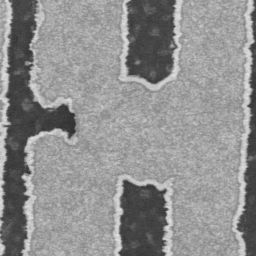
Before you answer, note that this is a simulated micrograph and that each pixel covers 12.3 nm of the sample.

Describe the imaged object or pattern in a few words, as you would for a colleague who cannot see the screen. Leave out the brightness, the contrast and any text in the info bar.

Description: one or a few lines or trenches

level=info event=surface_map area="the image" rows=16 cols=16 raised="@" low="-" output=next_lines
@--@@@@@---@@@@@
@-@@@@@@---@@@@@
--@@@@@@---@@@@@
--@@@@@@---@@@@@
--@@@@@@---@@@@-
--@@@@@@@@@@@@@-
----@@@@@@@@@@@-
-----@@@@@@@@@@-
--@@-@@@@@@@@@@-
--@@@@@@@@@@@@@-
--@@@@@@@@@@@@@-
--@@@@@@--@@@@@-
--@@@@@---@@@@@-
--@@@@@----@@@@-
--@@@@@----@@@@-
--@@@@@----@@@@-